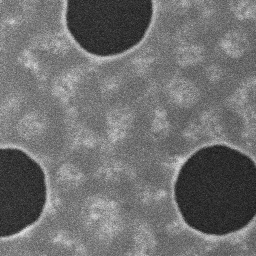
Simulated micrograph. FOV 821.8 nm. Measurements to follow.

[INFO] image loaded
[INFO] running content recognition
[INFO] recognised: holes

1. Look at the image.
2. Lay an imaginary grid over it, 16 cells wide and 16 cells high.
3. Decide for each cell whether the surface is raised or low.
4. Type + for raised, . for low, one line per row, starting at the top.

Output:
++++......++++++
++++.....+++++++
+++++....+++++++
++++++.+++++++++
++++++++++++++++
++++++++++++++++
++++++++++++++++
++++++++++++++++
++++++++++++++++
.+++++++++++...+
...++++++++.....
...++++++++.....
...++++++++.....
...++++++++.....
.++++++++++++..+
++++++++++++++++